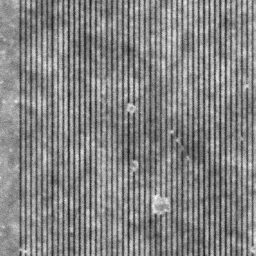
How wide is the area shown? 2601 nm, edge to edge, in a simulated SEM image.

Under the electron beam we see parallel lines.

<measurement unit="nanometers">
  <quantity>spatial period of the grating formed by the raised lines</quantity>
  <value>54.9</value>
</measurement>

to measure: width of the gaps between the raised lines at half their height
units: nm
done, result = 17.8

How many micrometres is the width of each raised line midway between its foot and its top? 0.0368